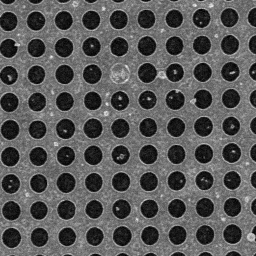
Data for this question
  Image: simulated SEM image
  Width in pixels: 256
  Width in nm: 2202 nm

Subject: a regular array of holes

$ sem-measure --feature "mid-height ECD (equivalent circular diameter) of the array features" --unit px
19.2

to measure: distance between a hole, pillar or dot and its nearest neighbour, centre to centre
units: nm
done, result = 231